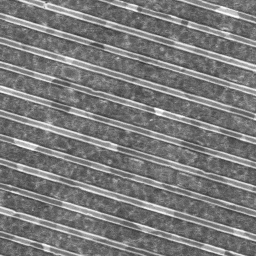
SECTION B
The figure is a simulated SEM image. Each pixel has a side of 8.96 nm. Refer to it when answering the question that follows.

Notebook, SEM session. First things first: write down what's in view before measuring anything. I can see parallel lines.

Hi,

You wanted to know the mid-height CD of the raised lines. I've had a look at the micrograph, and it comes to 42.9 nm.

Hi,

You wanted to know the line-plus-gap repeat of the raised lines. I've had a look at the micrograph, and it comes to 208 nanometres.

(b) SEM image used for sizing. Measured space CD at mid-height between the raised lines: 0.161 microns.